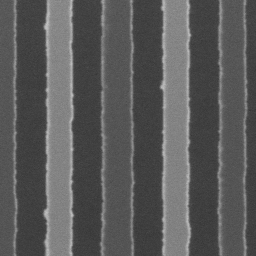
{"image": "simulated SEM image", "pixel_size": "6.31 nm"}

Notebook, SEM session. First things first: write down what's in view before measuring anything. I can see lines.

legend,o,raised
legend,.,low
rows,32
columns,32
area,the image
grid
oo....ooo....ooo....oooo....ooo.
oo....ooo....ooo....oooo....ooo.
oo....ooo....ooo....oooo....ooo.
oo....ooo....ooo....oooo...oooo.
oo....ooo....ooo....oooo...oooo.
oo....ooo....oooo...oooo....ooo.
oo....ooo....oooo...oooo....ooo.
oo....ooo....ooo....oooo....ooo.
oo....ooo....ooo....oooo....ooo.
oo....ooo....ooo....oooo....ooo.
oo....ooo....ooo....oooo....ooo.
oo....ooo....ooo....oooo....ooo.
oo....ooo....ooo....oooo...oooo.
oo....ooo....ooo....oooo....ooo.
oo....ooo....ooo....oooo....ooo.
oo....ooo....oooo...oooo....ooo.
oo....ooo....oooo...oooo....ooo.
oo....ooo....oooo...oooo....ooo.
oo....ooo....oooo...oooo...oooo.
oo....ooo....oooo...oooo...oooo.
oo....ooo....ooo....oooo...oooo.
oo....ooo....oooo...oooo...oooo.
oo....ooo....oooo...oooo...oooo.
oo....ooo....oooo...oooo...oooo.
oo....ooo....oooo...oooo...oooo.
oo....ooo....ooo....oooo...oooo.
oo....ooo....oooo...oooo...oooo.
oo....ooo....oooo...oooo...oooo.
oo....ooo....ooo....oooo...oooo.
oo....ooo....oooo...oooo...oooo.
oo....ooo....oooo...oooo...oooo.
oo....ooo....oooo...oooo....ooo.